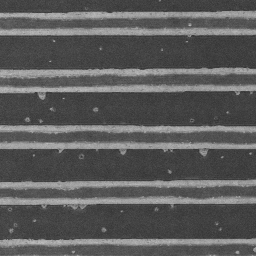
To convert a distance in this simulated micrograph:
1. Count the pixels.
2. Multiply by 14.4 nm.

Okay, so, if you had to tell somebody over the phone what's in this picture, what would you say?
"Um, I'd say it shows lines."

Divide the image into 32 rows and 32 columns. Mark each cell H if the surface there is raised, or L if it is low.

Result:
LLLLLLLLLLLLLLLLLLLLLLLLLLLLLLLL
LLLLLLLLLLLLLLLLLLLLLLLLLLLLLLLL
HHHHHHHHHHHHHHHHHHHHHHHHHHHHHHHH
HHHHHHHHHHHHHHHHHHHHHHHHHHHHHHHH
LLLLLLLLLLLLLLLLLLLLLLLLLLLLLLLL
LLLLLLLLLLLLLLLLLLLLLLLLLLLLLLLL
LLLLLLLLLLLLLLLLLLLLLLLLLLLLLLLL
LLLLLLLLLLLLLLLLLLLLLLLLLLLLLLLL
LLLLLLLLLLLLLLLLLLLLLLLLLLLLLLLL
HHHHHHHHHHHHHHHHHHHHHHHHHHHHHHHH
HHHHHHHHHHHHHHHHHHHHHHHHHHHHHHHH
LLLLLLLLLLLLLLLLLLLLLLLLLLLLLLLL
LLLLLLLLLLLLLLLLLLLLLLLLLLLLLLLL
LLLLLLLLLLLLLLLLLLLLLLLLLLLLLLLL
LLLLLLLLLLLLLLLLLLLLLLLLLLLLLLLL
LLLLLLLLLLLLLLLLLLLLLLLLLLLLLLLL
HHHHHHHHHHHHHHHHHHHHHHHHHHHHHHHH
HHHHHHHHHHHHHHHHHHHHHHHHHHHHHHHH
LLLLLLLLLLLLLLLLLLLLLLLLLLLLLLLL
LLLLLLLLLLLLLLLLLLLLLLLLLLLLLLLL
LLLLLLLLLLLLLLLLLLLLLLLLLLLLLLLL
LLLLLLLLLLLLLLLLLLLLLLLLLLLLLLLL
LLLLLLLLLLLLLLLLLLLLLLLLLLLLLLLL
HHHHHHHHHHHHHHHHHHHHHHHHHHHHHHHH
HHHHHHHHHHHHHHHHHHHHHHHHHHHHHHHH
LLLLLLLLLLLLLLLLLLLLLLLLLLLLLLLL
LLLLLLLLLLLLLLLLLLLLLLLLLLLLLLLL
LLLLLLLLLLLLLLLLLLLLLLLLLLLLLLLL
LLLLLLLLLLLLLLLLLLLLLLLLLLLLLLLL
LLLLLLLLLLLLLLLLLLLLLLLLLLLLLLLL
HHHHHHHHHHHHHHHHHHHHHHHHHHHHHHHH
HHHHHHHHHHHHHHHHHHHHHHHHHHHHHHHH